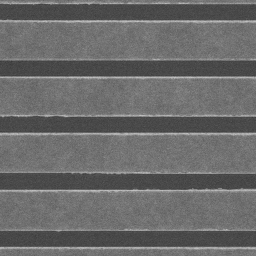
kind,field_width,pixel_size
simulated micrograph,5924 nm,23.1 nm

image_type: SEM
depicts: lines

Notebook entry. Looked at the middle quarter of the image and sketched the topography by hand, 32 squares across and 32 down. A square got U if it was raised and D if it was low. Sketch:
DDDDDDDDDDDDDDDDDDDDDDDDDDDDDDDD
DDDDDDDDDDDDDDDDDDDDDDDDDDDDDDDD
DDDDDDDDDDDDDDDDDDDDDDDDDDDDDDDD
UUUUUUUUUUUUUUUUUUUUUUUUUUUUUUUU
UUUUUUUUUUUUUUUUUUUUUUUUUUUUUUUU
UUUUUUUUUUUUUUUUUUUUUUUUUUUUUUUU
UUUUUUUUUUUUUUUUUUUUUUUUUUUUUUUU
UUUUUUUUUUUUUUUUUUUUUUUUUUUUUUUU
UUUUUUUUUUUUUUUUUUUUUUUUUUUUUUUU
UUUUUUUUUUUUUUUUUUUUUUUUUUUUUUUU
UUUUUUUUUUUUUUUUUUUUUUUUUUUUUUUU
UUUUUUUUUUUUUUUUUUUUUUUUUUUUUUUU
UUUUUUUUUUUUUUUUUUUUUUUUUUUUUUUU
DDDDDDDDDDDDDDDDDDDDDDDDDDDDDDDD
DDDDDDDDDDDDDDDDDDDDDDDDDDDDDDDD
DDDDDDDDDDDDDDDDDDDDDDDDDDDDDDDD
DDDDDDDDDDDDDDDDDDDDDDDDDDDDDDDD
UUUUUUUUUUUUUUUUUUUUUUUUUUUUUUUU
UUUUUUUUUUUUUUUUUUUUUUUUUUUUUUUU
UUUUUUUUUUUUUUUUUUUUUUUUUUUUUUUU
UUUUUUUUUUUUUUUUUUUUUUUUUUUUUUUU
UUUUUUUUUUUUUUUUUUUUUUUUUUUUUUUU
UUUUUUUUUUUUUUUUUUUUUUUUUUUUUUUU
UUUUUUUUUUUUUUUUUUUUUUUUUUUUUUUU
UUUUUUUUUUUUUUUUUUUUUUUUUUUUUUUU
UUUUUUUUUUUUUUUUUUUUUUUUUUUUUUUU
UUUUUUUUUUUUUUUUUUUUUUUUUUUUUUUU
DDDDDDDDDDDDDDDDDDDDDDDDDDDDDDDD
DDDDDDDDDDDDDDDDDDDDDDDDDDDDDDDD
DDDDDDDDDDDDDDDDDDDDDDDDDDDDDDDD
DDDDDDDDDDDDDDDDDDDDDDDDDDDDDDDD
DDDDDDDDDDDDDDDDDDDDDDDDDDDDDDDD